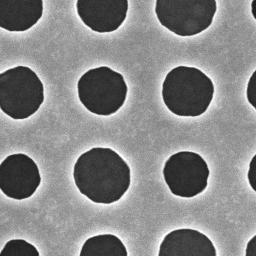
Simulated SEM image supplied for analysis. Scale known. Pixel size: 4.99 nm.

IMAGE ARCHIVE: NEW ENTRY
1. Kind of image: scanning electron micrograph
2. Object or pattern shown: holes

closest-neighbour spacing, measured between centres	0.417	microns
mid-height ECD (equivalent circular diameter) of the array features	251	nm